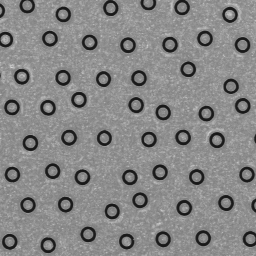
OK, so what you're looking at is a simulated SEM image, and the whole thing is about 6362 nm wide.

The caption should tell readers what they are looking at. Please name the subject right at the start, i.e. a regular array of ring-shaped grooves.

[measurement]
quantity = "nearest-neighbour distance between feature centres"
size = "800 nm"